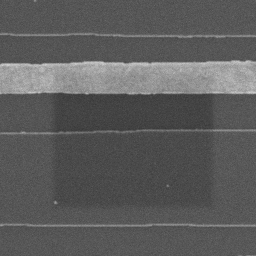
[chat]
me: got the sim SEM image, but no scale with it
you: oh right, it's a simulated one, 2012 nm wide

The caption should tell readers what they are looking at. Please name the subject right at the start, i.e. lines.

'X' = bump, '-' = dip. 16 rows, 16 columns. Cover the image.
XXXXXXXXXXXXXXXX
XXXXXXXXXXXXXXXX
----------------
----------------
XXXXXXXXXXXXXXXX
XXXXXXXXXXXXXXXX
----------------
----------------
XXXXXXXXXXXXXXXX
XXXXXXXXXXXXXXXX
XXXXXXXXXXXXXXXX
XXXXXXXXXXXXXXXX
XXXXXXXXXXXXXXXX
XXXXXXXXXXXXXXXX
----------------
----------------